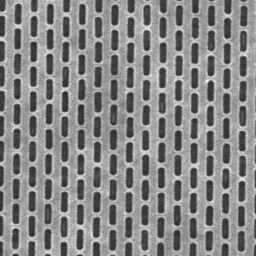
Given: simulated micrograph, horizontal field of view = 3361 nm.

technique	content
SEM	a regular array of holes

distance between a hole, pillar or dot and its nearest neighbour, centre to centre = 264 nm